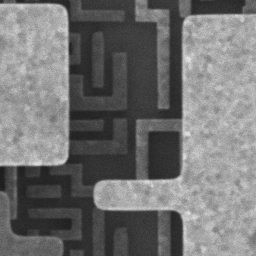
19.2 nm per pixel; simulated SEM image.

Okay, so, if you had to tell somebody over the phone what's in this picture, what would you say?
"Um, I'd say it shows wiring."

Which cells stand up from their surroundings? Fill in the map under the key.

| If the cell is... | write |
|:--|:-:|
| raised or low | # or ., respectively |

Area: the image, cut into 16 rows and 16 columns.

####............
####.......#####
####.......#####
####.......#####
####.......#####
####.......#####
####.......#####
####.......#####
####.......#####
####.......#####
...........#####
......##########
#.....##########
#..........#####
#..........#####
####.......#####